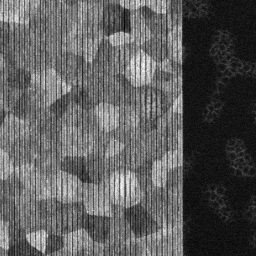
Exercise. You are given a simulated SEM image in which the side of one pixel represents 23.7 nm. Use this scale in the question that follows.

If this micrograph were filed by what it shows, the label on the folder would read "parallel lines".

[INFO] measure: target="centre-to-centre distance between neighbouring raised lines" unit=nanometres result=125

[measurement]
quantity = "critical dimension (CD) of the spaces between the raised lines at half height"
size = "1.5 px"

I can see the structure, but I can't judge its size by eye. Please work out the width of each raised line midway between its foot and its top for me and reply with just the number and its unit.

85.8 nanometres